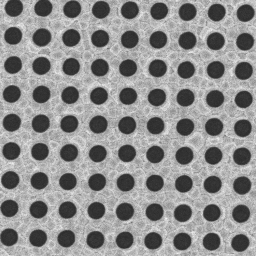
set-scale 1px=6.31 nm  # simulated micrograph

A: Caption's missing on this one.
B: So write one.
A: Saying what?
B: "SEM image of a regular array of holes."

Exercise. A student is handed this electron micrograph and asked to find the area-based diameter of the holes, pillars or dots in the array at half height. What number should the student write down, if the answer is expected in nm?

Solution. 110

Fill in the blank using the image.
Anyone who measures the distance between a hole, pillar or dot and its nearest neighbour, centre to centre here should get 178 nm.